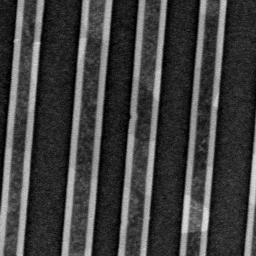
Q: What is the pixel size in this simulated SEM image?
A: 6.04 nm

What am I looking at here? one or a few lines or trenches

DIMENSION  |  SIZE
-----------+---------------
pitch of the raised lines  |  0.366 µm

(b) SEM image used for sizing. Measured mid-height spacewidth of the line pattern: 238 nanometres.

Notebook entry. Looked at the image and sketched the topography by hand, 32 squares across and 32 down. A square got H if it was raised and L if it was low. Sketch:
LLLHHLLLLLLHHHLLLLHHLLLLLHHHLLLL
LLLHHLLLLLLHHLLLLLHHLLLLLHHHLLLL
LLHHHLLLLLLHHLLLLLHHLLLLLHHHLLLL
LLHHHLLLLLLHHLLLLHHHLLLLLHHHLLLL
LLHHHLLLLLHHHLLLLHHHLLLLLHHHLLLL
LLHHHLLLLLHHHLLLLHHHLLLLLHHLLLLL
LLHHLLLLLLHHHLLLLHHHLLLLLHHLLLLL
LLHHLLLLLLHHHLLLLHHHLLLLLHHLLLLL
LLHHLLLLLLHHHLLLLHHHLLLLLHHLLLLL
LLHHLLLLLLHHHLLLLHHHLLLLLHHLLLLL
LLHHLLLLLLHHHLLLLHHHLLLLLHHLLLLL
LLHHLLLLLLHHHLLLLHHHLLLLHHHLLLLL
LLHHLLLLLLHHHLLLLHHLLLLLHHHLLLLL
LLHHLLLLLLHHLLLLLHHLLLLLHHHLLLLL
LHHHLLLLLLHHLLLLLHHLLLLLHHHLLLLL
LHHHLLLLLLHHLLLLLHHLLLLLHHHLLLLL
LHHHLLLLLHHHLLLLLHHLLLLLHHHLLLLL
LHHHLLLLLHHHLLLLHHHLLLLLHHLLLLLL
LHHLLLLLLHHHLLLLHHHLLLLLHHLLLLLL
LHHLLLLLLHHHLLLLHHHLLLLLHHLLLLLL
LHHLLLLLLHHHLLLLHHHLLLLLHHLLLLLL
LHHLLLLLLHHHLLLLHHHLLLLLHHLLLLLL
LHHLLLLLLHHHLLLLHHHLLLLLHHLLLLLL
LHHLLLLLLHHHLLLLHHHLLLLLHHLLLLLL
LHHLLLLLLHHHLLLLHHLLLLLHHHLLLLLL
LHHLLLLLLHHHLLLLHHLLLLLHHHLLLLLH
HHHLLLLLLHHLLLLLHHLLLLLHHHLLLLLH
HHHLLLLLLHHLLLLLHHLLLLLHHHLLLLLH
HHHLLLLLHHHLLLLHHHLLLLLHHHLLLLLH
HHHLLLLLHHHLLLLHHHLLLLLHHLLLLLLH
HHHLLLLLHHHLLLLHHHLLLLLHHLLLLLLH
HHLLLLLLHHHLLLLHHHLLLLLHHLLLLLLH